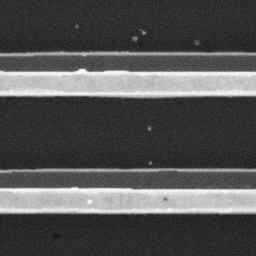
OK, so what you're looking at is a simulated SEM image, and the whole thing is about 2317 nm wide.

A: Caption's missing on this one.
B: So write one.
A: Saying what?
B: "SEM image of lines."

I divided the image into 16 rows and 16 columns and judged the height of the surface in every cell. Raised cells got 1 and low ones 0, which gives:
0000000000000000
0000000000000000
0000000000000000
1111111111111111
1111111111111111
1111111111111111
0000000000000000
0000000000000000
0000000000000000
0000000000000000
0000000000000000
1111111111111111
1111111111111111
0000000000000000
0000000000000000
0000000000000000